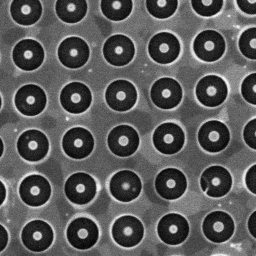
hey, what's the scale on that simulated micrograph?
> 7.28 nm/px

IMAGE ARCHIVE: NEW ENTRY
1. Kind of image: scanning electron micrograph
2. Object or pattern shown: an array of small figures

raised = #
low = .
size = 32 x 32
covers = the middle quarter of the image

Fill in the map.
.....########..#################
################################
################################
########################...#####
##..########.....######......###
......#####.......####.......###
.......###........####...#....##
.......###...##...###....##...##
..##...###...##...####........##
.......####.......####.......###
.......####......######.....####
......######....#########.######
###.############################
################################
#########################...####
##############...#######.....###
#.....######......#####.......##
.......####........###........##
.......####...##...###...##...##
...#....###...##...###...##...##
...#....###........####.......##
.......####.......#####......###
......######.....########..#####
##...###########################
################################
################################
###############.#########....###
##....######......#####.......##
#......####........####.......##
........###........####...##...#
...##...###....#....###...#....#
...##....##........####.......##